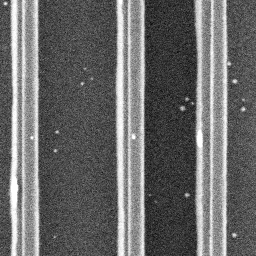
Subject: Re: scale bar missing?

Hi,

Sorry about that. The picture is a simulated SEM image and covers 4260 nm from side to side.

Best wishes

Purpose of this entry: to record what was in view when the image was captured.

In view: lines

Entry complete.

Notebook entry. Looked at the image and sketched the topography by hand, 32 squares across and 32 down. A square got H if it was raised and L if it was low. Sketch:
LLHHHLLLLLLLLLLHHHLLLLLLLHHHLLLL
LLHHHLLLLLLLLLLHHHLLLLLLLHHHLLLL
LLHHHLLLLLLLLLLHHHLLLLLLLHHHLLLL
LLHHHLLLLLLLLLLHHHLLLLLLLHHHLLLL
LLHHHLLLLLLLLLLHHHLLLLLLLHHHLLLL
LLHHHLLLLLLLLLLHHHLLLLLLLHHHLLLL
LLHHHLLLLLLLLLLHHHLLLLLLLHHHLLLL
LLHHHLLLLLLLLLLHHHLLLLLLLHHHLLLL
LLHHHLLLLLLLLLLHHHLLLLLLLHHHLLLL
LLHHHLLLLLLLLLLHHHLLLLLLLHHHLLLL
LLHHHLLLLLLLLLLHHHLLLLLLLHHHLLLL
LLHHHLLLLLLLLLLHHHLLLLLLLHHHLLLL
LLHHHLLLLLLLLLLHHHLLLLLLLHHHLLLL
LLHHHLLLLLLLLLLHHHLLLLLLLHHHLLLL
LLHHHLLLLLLLLLLHHHLLLLLLLHHHLLLL
LLHHHLLLLLLLLLLHHHLLLLLLLHHHLLLL
LLHHHLLLLLLLLLLHHHLLLLLLLHHHLLLL
LLHHHLLLLLLLLLLHHHLLLLLLLHHHLLLL
LLHHHLLLLLLLLLLHHHLLLLLLLHHHLLLL
LLHHHLLLLLLLLLLHHHLLLLLLLHHHLLLL
LLHHHLLLLLLLLLLHHHLLLLLLLHHHLLLL
LLHHHLLLLLLLLLLHHHLLLLLLLHHHLLLL
LLHHHLLLLLLLLLLHHHLLLLLLLHHHLLLL
LHHHHLLLLLLLLLLHHHLLLLLLLHHHLLLL
LLHHHLLLLLLLLLLHHHLLLLLLLHHHLLLL
LLHHHLLLLLLLLLLHHHLLLLLLLHHHLLLL
LLHHHLLLLLLLLLLHHHLLLLLLLHHHLLLL
LLHHHLLLLLLLLLLHHHLLLLLLLHHHLLLL
LLHHHLLLLLLLLLLHHHLLLLLLLHHHLLLL
LLHHHLLLLLLLLLLHHHLLLLLLLHHHLLLL
LLHHHLLLLLLLLLLHHHLLLLLLLHHHLLLL
LLHHHLLLLLLLLLLHHHLLLLLLLHHHLLLL